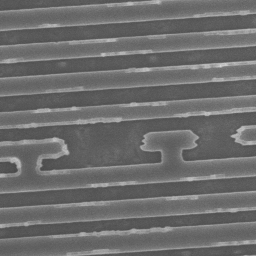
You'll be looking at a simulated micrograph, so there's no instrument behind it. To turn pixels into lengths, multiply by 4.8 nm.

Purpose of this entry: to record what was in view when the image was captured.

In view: parallel lines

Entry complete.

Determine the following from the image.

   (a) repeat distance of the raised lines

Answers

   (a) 156 nm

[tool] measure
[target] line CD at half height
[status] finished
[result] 0.0885 um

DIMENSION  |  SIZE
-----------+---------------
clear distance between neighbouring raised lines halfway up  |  14.6 pixels